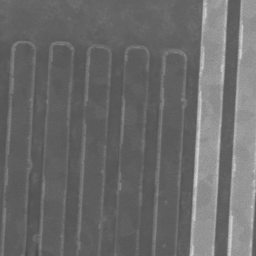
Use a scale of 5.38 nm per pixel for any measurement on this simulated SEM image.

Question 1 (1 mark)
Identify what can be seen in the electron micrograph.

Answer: parallel lines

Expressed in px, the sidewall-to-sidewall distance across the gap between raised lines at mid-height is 13.7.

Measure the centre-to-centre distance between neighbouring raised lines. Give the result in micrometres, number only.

0.203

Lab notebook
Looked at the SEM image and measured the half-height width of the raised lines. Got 127 nm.